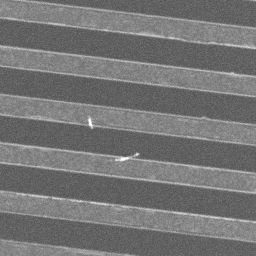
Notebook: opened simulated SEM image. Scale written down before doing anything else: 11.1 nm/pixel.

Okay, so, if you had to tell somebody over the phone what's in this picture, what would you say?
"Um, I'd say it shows parallel lines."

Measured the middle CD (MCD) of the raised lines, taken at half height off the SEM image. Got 0.326 microns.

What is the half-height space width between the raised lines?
210 nanometers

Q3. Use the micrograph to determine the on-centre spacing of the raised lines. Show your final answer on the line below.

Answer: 0.532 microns